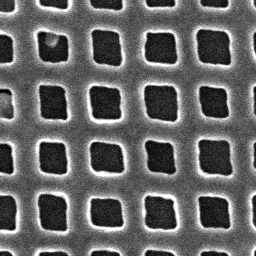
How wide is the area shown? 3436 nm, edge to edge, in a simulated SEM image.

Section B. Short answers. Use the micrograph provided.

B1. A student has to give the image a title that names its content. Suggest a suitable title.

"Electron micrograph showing a regular array of holes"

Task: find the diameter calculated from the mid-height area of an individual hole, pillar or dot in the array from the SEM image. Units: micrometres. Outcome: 0.471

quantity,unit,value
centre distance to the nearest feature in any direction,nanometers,720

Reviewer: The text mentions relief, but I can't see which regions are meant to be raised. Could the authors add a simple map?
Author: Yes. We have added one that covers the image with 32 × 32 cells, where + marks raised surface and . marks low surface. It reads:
..+++....++....+++....+++....+++
..++++++++++++++++++++++++++++++
++++++++++++++++++++++++++++++++
++++++++++++++++++++++++++++++++
.++++...+++....+++....++.....+++
..+++....+++...+++....+++....+++
..+++....+++...+++....+++....+++
..+++...++++...+++....+++....+++
++++++++++++++++++++++++++++++++
++++++++++++++++++++++++++++++++
++++++++++++++++++++++++++++++++
.++++...+++....+++....+++...++++
+++++...+++....+++....+++...++++
..+++...+++....+++....+++...++++
..+++....+++...++++...++++..++++
++++++++++++++++++++++++++++++++
++++++++++++++++++++++++++++++++
+++++++++++++++++++++++++.++++++
..+++...+++....+++....+++....+++
..+++...+++.....++....+++....+++
..+++....++.....++....+++....+++
..+++...++++...++++...+++....+++
++++++++++++++++++++++++++++++++
++++++++++++++++++++++++++++++++
.++++...++++++++++..+++++..+++++
..+++...+++....+++....+++....++.
..+++...+++....+++....+++....+++
..+++...+++....+++....+++....+++
..+++...++++++++++....+++++.++++
++++++++++++++++++++++++++++++++
++++++++++++++++++++++++++++++++
.++++...++++..++++...++++...++++